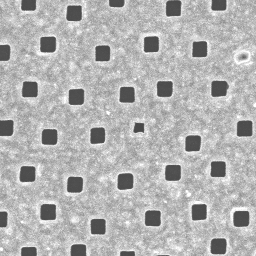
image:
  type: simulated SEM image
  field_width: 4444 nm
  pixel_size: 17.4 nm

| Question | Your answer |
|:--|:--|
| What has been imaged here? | a regular array of holes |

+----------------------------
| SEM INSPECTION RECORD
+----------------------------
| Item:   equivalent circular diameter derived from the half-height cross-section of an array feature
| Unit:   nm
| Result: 307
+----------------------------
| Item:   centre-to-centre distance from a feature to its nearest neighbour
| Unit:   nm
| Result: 747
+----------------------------